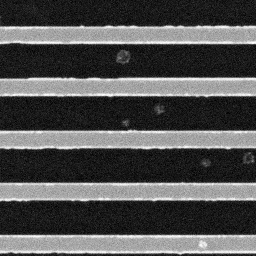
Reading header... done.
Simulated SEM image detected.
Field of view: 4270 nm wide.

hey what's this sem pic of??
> lines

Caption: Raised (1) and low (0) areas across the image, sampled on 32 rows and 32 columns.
00000000000000000000000000000000
00000000000000000000000000000000
00000000000000000000000000000000
11111111111111111111111111111111
11111111111111111111111111111111
00000000000000000000000000000000
00000000000000000000000000000000
00000000000000000000000000000000
00000000000000000000000000000000
00000000000000000000000000000000
11111111111111111111111111111111
11111111111111111111111111111111
00000000000000000000000000000000
00000000000000000000000000000000
00000000000000000000000000000000
00000000000000000000000000000000
11111111111111111111111111111111
11111111111111111111111111111111
11111101110000000111100000001000
00000000000000000000000000000000
00000000000000000000000000000000
00000000000000000000000000000000
00000000000000000000000000000000
11111111111111111111111111111111
11111111111111111111111111111111
00000000000000000000000000000000
00000000000000000000000000000000
00000000000000000000000000000000
00000000000000000000000000000000
11111111111111111111111111111111
11111111111111111111111111111111
11111111111111111111111111111111